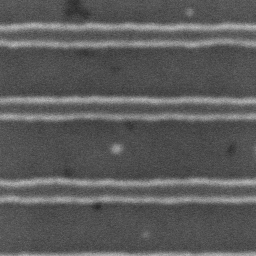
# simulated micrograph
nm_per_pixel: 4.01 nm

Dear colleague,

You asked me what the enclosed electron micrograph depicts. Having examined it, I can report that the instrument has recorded lines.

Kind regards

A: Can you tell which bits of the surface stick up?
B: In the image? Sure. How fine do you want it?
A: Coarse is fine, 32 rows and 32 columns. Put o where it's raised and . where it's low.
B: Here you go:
................................
................................
................................
oooooooooooooooooooooooooooooooo
oooooooooooooooooooooooooooooooo
oooooooooooooooooooooooooo....oo
................................
................................
................................
................................
................................
................................
oooooooooooooooooooooooooooooo.o
oooooooooooooooooooooooooooooooo
oooooooooooooooooooooooooooooooo
................................
................................
................................
................................
................................
................................
................................
.....oooo...............oo......
oooooooooooooooooooooooooooooooo
oooooooooooooooooooooooooooooooo
................................
................................
................................
................................
................................
................................
................................